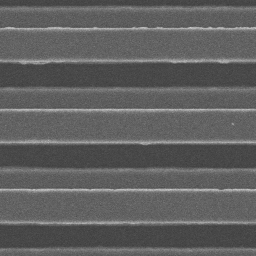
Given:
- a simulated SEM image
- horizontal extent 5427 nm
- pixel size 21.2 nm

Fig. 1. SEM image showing lines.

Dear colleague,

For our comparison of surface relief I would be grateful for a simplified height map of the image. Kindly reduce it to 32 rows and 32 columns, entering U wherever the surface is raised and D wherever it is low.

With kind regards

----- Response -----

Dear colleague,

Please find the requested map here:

DDDDDDDDDDDDDDDDDDDDDDDDDDDDDDDD
UUUUUUUUUUUUUUUUUUUUUUUUUUUUUUUU
UUUUUUUUUUUUUUUUUUUUUUUUUUUUUUUU
UUUUUUUUUUUUUUUUUUUUUUUUUUUUUUUU
UUUUUUUUUUUUUUUUUUUUUUUUUUUUUUUU
UUUUUUUUUUUUUUUUUUUUUUUUUUUUUUUU
UUUUUUUUUUUUUUUUUUUUUUUUUUUUUUUU
UUUUUUUUUUUUUUUUUUUUUUUUUUUUUUUU
DDDDDDDDDDDDDDDDDDDDDDDDDDDDDDDD
DDDDDDDDDDDDDDDDDDDDDDDDDDDDDDDD
DDDDDDDDDDDDDDDDDDDDDDDDDDDDDDDD
UUUUUUUUUUUUUUUUUUUUUUUUUUUUUUUU
UUUUUUUUUUUUUUUUUUUUUUUUUUUUUUUU
UUUUUUUUUUUUUUUUUUUUUUUUUUUUUUUU
UUUUUUUUUUUUUUUUUUUUUUUUUUUUUUUU
UUUUUUUUUUUUUUUUUUUUUUUUUUUUUUUU
UUUUUUUUUUUUUUUUUUUUUUUUUUUUUUUU
UUUUUUUUUUUUUUUUUUUUUUUUUUUUUUUU
DDDDDDDDDDDDDDDDDDDDDDDDDDDDDDDD
DDDDDDDDDDDDDDDDDDDDDDDDDDDDDDDD
DDDDDDDDDDDDDDDDDDDDDDDDDDDDDDDD
UUUUUUUUUUUUUUUUUUUUUUUUUUUUUUUU
UUUUUUUUUUUUUUUUUUUUUUUUUUUUUUUU
UUUUUUUUUUUUUUUUUUUUUUUUUUUUUUUU
UUUUUUUUUUUUUUUUUUUUUUUUUUUUUUUU
UUUUUUUUUUUUUUUUUUUUUUUUUUUUUUUU
UUUUUUUUUUUUUUUUUUUUUUUUUUUUUUUU
UUUUUUUUUUUUUUUUUUUUUUUUUUUUUUUU
DDDDDDDDDDDDDDDDDDDDDDDDDDDDDDDD
DDDDDDDDDDDDDDDDDDDDDDDDDDDDDDDD
DDDDDDDDDDDDDDDDDDDDDDDDDDDDDDDD
UUUUUUUUUUUUUUUUUUUUUUUUUUUUUUUU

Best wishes